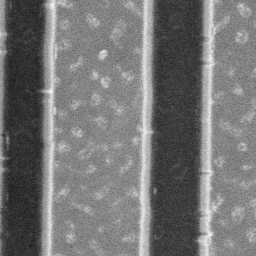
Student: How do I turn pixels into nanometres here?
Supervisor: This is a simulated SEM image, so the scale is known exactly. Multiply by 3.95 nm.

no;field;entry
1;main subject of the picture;one or a few lines or trenches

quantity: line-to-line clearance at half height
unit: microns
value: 0.233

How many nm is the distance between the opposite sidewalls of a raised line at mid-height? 390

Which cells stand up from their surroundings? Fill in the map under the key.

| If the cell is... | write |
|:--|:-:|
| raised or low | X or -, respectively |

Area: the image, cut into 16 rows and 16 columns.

---XXXXXX----XXX
---XXXXXX----XXX
---XXXXXX----XXX
---XXXXXX----XXX
---XXXXXX----XXX
---XXXXXX----XXX
---XXXXXX----XXX
---XXXXXX----XXX
---XXXXXX----XXX
---XXXXXX----XXX
---XXXXXX----XXX
---XXXXXX----XXX
---XXXXXX----XXX
---XXXXXX----XXX
---XXXXXX----XXX
---XXXXXX----XXX